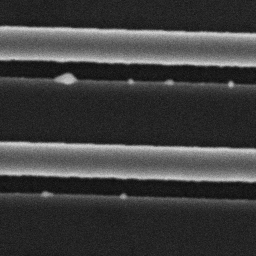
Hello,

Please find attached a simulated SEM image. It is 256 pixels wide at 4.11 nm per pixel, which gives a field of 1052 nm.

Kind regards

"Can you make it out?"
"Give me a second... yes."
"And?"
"lines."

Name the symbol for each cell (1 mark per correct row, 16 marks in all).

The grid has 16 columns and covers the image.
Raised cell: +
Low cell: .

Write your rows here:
................
................
++++++++++++++++
++++++++++++++++
................
................
................
................
................
++++++++++++++++
++++++++++++++++
................
................
................
................
................